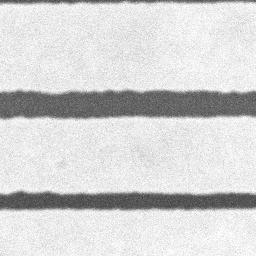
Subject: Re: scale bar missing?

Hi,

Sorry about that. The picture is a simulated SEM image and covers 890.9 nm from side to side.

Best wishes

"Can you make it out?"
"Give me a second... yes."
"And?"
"lines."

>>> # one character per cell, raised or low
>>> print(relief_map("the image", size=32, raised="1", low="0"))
00000000001000011111110000011111
11111111111111111111111111111111
11111111111111111111111111111111
11111111111111111111111111111111
11111111111111111111111111111111
11111111111111111111111111111111
11111111111111111111111111111111
11111111111111111111111111111111
11111111111111111111111111111111
11111111111111111111111111111111
11111111111111111111111111111111
00000011000000000000000000000000
00000000000000000000000000000000
00000000000000000000000000000000
00000000000000000000000000000000
11111111111111111111111111111111
11111111111111111111111111111111
11111111111111111111111111111111
11111111111111111111111111111111
11111111111111111111111111111111
11111111111111111111111111111111
11111111111111111111111111111111
11111111111111111111111111111111
11111111111111111111111111111111
00000000000000000000000000000000
00000000000000000000000000000000
11111111111111111111111111111111
11111111111111111111111111111111
11111111111111111111111111111111
11111111111111111111111111111111
11111111111111111111111111111111
11111111111111111111111111111111